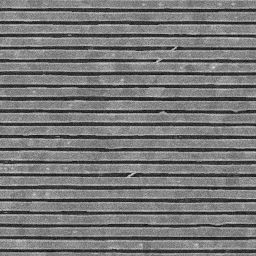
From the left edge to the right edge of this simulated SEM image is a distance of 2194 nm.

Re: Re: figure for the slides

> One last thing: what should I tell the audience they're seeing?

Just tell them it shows parallel lines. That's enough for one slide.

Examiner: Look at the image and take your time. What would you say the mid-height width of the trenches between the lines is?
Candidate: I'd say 0.0386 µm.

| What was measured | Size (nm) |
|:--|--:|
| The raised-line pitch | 109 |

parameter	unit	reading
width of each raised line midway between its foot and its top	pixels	8.25